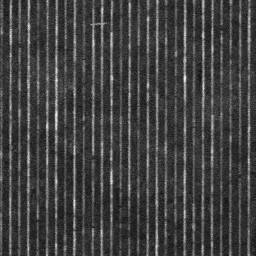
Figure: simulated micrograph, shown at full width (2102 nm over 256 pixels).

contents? parallel lines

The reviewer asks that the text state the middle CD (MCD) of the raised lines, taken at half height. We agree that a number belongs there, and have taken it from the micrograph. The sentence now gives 0.0113 micrometres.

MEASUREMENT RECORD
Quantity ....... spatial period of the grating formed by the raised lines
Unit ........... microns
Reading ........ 0.0752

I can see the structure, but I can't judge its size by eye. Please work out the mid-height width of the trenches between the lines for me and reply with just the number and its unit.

64.7 nanometres